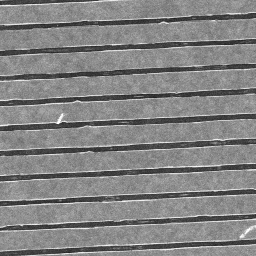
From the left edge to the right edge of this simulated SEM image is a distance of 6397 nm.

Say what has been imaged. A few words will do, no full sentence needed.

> parallel lines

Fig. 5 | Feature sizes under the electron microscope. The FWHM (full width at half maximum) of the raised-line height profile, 487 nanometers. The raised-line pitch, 627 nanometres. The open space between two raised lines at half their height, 140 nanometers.